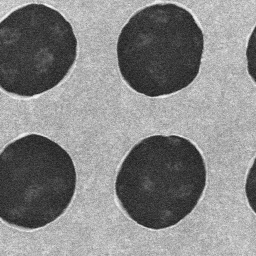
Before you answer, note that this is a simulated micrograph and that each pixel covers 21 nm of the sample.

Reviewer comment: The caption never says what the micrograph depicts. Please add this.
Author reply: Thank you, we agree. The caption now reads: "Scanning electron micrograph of holes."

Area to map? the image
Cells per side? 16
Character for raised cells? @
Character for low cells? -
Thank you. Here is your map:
@--@@@@@@--@@@@@
----@@@@----@@@@
-----@@------@@@
-----@@------@@-
----@@@@----@@@@
---@@@@@---@@@@@
@@@@@@@@@@@@@@@@
@@@@@@@@@@@@@@@@
@@-@@@@@@--@@@@@
----@@@@----@@@@
-----@@------@@@
-----@@------@@-
----@@@-----@@@-
----@@@@----@@@@
@@@@@@@@@@@@@@@@
@@@@@@@@@@@@@@@@